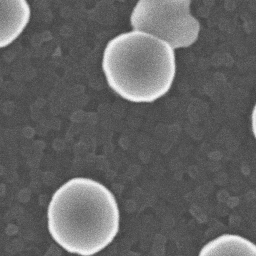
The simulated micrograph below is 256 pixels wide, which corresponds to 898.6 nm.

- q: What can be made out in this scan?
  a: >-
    raised bodies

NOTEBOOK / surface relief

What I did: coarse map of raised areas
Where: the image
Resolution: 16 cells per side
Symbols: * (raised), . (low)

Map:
**.......**.....
**......****....
*......*****....
.......****.....
.......****.....
.......***......
................
................
................
................
................
....**..........
...****.........
...****.........
...****.........
....**.......***